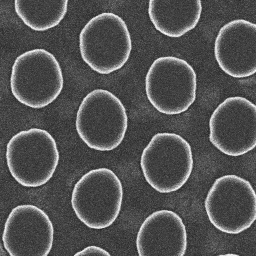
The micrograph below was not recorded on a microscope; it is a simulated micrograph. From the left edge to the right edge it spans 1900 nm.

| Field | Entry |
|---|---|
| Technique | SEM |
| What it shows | raised bodies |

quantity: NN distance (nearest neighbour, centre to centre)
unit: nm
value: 574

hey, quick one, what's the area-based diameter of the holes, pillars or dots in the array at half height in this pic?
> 399 nanometres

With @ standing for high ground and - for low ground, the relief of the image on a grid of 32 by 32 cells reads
--@@@@@@-----------@@@@@@-------
--@@@@@@-----------@@@@@@-------
---@@@@-----@@@----@@@@@@-------
----@@-----@@@@@----@@@@----@@@@
----------@@@@@@-----------@@@@@
----------@@@@@@-----------@@@@@
----@@----@@@@@@-----------@@@@@
--@@@@@----@@@@@----@@-----@@@@@
--@@@@@-----@@@----@@@@@----@@@@
--@@@@@@----------@@@@@@-----@--
-@@@@@@@----------@@@@@@--------
--@@@@@-----@-----@@@@@@--------
--@@@@-----@@@@----@@@@@----@@@-
----------@@@@@-----@@@----@@@@@
----------@@@@@@-----------@@@@@
----------@@@@@@----------@@@@@@
---@@@----@@@@@@----------@@@@@@
-@@@@@@----@@@@----@@@@----@@@@@
-@@@@@@-----@@----@@@@@@---@@@@-
-@@@@@@-----------@@@@@@--------
-@@@@@@-----------@@@@@@--------
-@@@@@@----@@@----@@@@@@--------
--@@@@----@@@@@---@@@@@----@@@--
---------@@@@@@----@@@-----@@@@-
---------@@@@@@-----------@@@@@@
---------@@@@@@-----------@@@@@@
--@@@-----@@@@@-----@-----@@@@@@
-@@@@@----@@@@----@@@@----@@@@@@
-@@@@@@-----------@@@@@----@@@@-
-@@@@@@----------@@@@@@---------
-@@@@@-----------@@@@@@---------
-@@@@@----@@@----@@@@@@---------